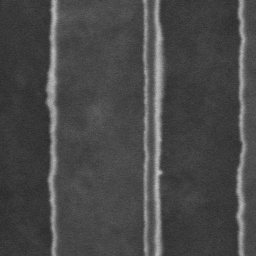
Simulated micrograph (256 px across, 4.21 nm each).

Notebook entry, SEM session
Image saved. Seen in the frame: lines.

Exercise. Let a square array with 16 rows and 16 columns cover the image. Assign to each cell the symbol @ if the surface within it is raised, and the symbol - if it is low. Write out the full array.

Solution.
---@@@@@@@-----@
---@@@@@@@-----@
---@@@@@@@-----@
---@@@@@@@-----@
---@@@@@@@-----@
---@@@@@@@-----@
---@@@@@@@-----@
---@@@@@@@-----@
---@@@@@@@-----@
---@@@@@@@-----@
---@@@@@@@-----@
---@@@@@@@-----@
---@@@@@@@-----@
---@@@@@@@-----@
---@@@@@@@-----@
---@@@@@@@-----@